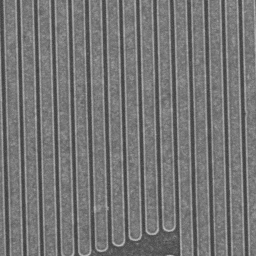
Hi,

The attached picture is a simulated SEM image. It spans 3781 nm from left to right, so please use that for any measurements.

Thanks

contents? parallel lines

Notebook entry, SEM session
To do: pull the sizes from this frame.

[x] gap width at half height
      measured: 75.7 nm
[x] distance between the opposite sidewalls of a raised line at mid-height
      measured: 177 nm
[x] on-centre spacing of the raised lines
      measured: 0.252 um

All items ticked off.